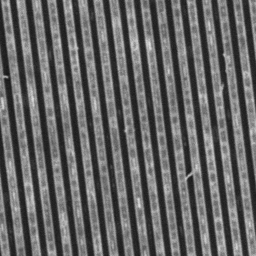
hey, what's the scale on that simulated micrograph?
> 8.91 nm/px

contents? parallel lines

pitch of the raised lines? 0.137 um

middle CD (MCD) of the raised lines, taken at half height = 0.0651 microns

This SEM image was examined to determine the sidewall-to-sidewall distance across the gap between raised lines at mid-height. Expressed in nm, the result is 65.1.